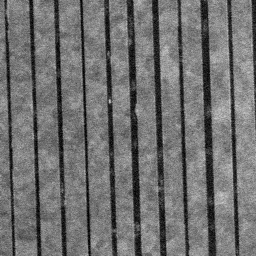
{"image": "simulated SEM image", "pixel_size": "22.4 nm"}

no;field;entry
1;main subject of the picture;parallel lines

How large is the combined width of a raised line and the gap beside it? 0.556 um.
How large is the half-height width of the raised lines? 19.1 pixels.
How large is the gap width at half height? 95.2 nanometers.